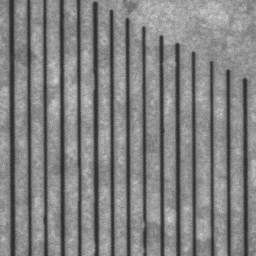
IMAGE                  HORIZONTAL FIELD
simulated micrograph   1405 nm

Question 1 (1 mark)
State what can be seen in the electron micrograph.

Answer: parallel lines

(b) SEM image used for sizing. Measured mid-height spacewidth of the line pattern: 23.3 nm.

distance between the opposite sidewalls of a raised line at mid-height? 70.7 nm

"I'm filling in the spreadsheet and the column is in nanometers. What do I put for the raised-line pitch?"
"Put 90.9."